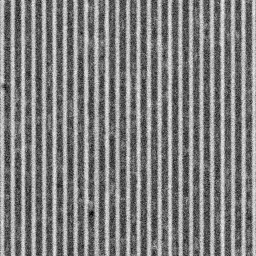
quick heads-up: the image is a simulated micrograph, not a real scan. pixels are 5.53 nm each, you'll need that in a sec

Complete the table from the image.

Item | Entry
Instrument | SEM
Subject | parallel lines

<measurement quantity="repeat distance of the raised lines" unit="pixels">10.5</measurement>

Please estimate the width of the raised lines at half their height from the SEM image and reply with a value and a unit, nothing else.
17.3 nanometers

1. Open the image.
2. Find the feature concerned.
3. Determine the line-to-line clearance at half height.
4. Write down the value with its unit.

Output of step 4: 39.4 nm